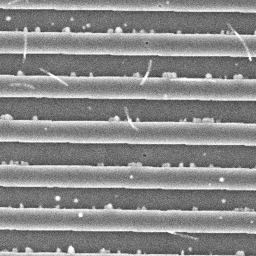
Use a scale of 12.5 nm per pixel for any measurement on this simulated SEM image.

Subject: lines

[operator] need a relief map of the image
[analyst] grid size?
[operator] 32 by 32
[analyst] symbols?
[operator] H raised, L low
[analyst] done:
HHHHHHHHHHHHHHHHHHHHHHHHHHHHHHHH
LLLLLLLLLLLLLLLLLLLLLLLLLLLLLLLL
LLLLLLLLLLLLLLLLLLLLLLLLLLLLLLLL
LLLLLLLLLLLLLLLLLLLLLLLLLLLLLLLL
HHHHHHHHHHHHHHHHHHHHHHHHHHHHHHHH
HHHHHHHHHHHHHHHHHHHHHHHHHHHHHHHH
HHHHHHHHHHHHHHHHHHHHHHHHHHHHHHHH
LLLLLLLLLLLLLLLLLLLLLLLLLLLLLLLL
LLLLLLLLLLLLLLLLLLLLLLLLLLLLLLLL
HHHLLLHLLLLLLLLLLLLLHHLLLLLLLLLL
HHHHHHHHHHHHHHHHHHHHHHHHHHHHHHHH
HHHHHHHHHHHHHHHHHHHHHHHHHHHHHHHH
LLLLLLLLLLLLLLLLLLLLLLLLLLLLLLLL
LLLLLLLLLLLLLLLLLLLLLLLLLLLLLLLL
LLLLLLLLLLLLLLLLLLLLLLLLLLLLLLLL
HHHHHHHHHHHHHHHHHHHHHHHHHHHHHHLL
HHHHHHHHHHHHHHHHHHHHHHHHHHHHHHHH
HHHHHHHHHHHHHHHHHHHHHHHHHHHHHHHH
LLLLLLLLLLLLLLLLLLLLLLLLLLLLLLLL
LLLLLLLLLLLLLLLLLLLLLLLLLLLLLLLL
LLLLLLLLLLLLLLLLLLLLLLLLLLLLLLLL
HHHHHHHHHHHHHHHHHHHHHHHHHHHHHHHH
HHHHHHHHHHHHHHHHHHHHHHHHHHHHHHHH
LLLLLLLLLLLLLLLLLLLLHHHHHHHHHHHH
LLLLLLLLLLLLLLLLLLLLLLLLLLLLLLLL
LLLLLLLLLLLLLLLLLLLLLLLLLLLLLLLL
HHHHHHHHHHHHHHHHHHHHHHHHHHHHHHHL
HHHHHHHHHHHHHHHHHHHHHHHHHHHHHHHH
HHHHHHHHHHHHHHHHHHHHHHHHHHHHHHHH
LLLLLLLLLLLLLLLLLLLLLLLLLLLLLLLL
LLLLLLLLLLLLLLLLLLLLLLLLLLLLLLLL
LLLHLLLLHLLLLLLLLLLLLLLLLLLLLLLL